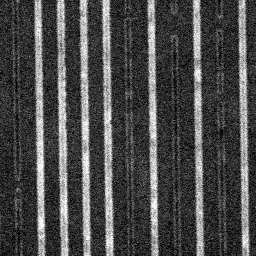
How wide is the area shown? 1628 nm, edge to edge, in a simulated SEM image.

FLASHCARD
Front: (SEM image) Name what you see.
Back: parallel lines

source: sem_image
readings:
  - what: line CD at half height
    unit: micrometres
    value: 0.0302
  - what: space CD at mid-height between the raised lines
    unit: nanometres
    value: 112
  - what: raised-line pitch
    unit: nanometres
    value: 144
